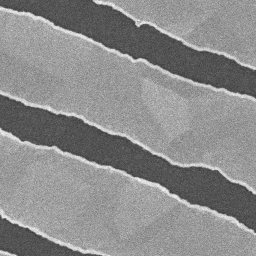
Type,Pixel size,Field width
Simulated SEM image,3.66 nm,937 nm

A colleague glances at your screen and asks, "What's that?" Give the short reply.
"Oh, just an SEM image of one or a few lines or trenches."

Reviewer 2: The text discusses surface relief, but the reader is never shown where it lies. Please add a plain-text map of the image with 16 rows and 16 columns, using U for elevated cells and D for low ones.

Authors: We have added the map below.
DDDDDDDUUUUUUUUU
UUUDDDDDDUUUUUUU
UUUUUUDDDDDUUUUU
UUUUUUUUDDDDDDUU
UUUUUUUUUUDDDDDD
UUUUUUUUUUUUUDDD
DDUUUUUUUUUUUUUU
DDDDDUUUUUUUUUUU
UDDDDDDDUUUUUUUU
UUUUDDDDDDUUUUUU
UUUUUUUDDDDDDUUU
UUUUUUUUUUDDDDDU
UUUUUUUUUUUDDDDD
UUUUUUUUUUUUUUDD
DDUUUUUUUUUUUUUU
DDDDDUUUUUUUUUUU